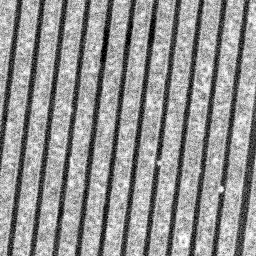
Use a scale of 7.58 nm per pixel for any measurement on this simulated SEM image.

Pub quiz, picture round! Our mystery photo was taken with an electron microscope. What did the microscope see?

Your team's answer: parallel lines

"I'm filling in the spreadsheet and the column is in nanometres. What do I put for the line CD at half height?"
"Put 112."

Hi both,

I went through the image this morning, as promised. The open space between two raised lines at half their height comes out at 59.2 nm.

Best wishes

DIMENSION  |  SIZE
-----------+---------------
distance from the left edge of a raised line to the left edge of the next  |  171 nm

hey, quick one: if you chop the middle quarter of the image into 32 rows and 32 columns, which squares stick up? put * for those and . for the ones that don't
***..****..***..****..****..***.
***..***...***..****..***...***.
***..***..****..****..***..****.
**...***..****..***...***..****.
**..****..****..***..****..****.
**..****..****..***..****..****.
**..****..***..****..****..***..
**..****..***..****..****..***..
**..****..***..****..****..***..
**..***..****..****..***...***..
**..***..****..****..***..****..
*...***..****..***...***..****..
*..****..****..***..****..****..
*..****..****..***..****..****..
*..****..***...***..****..***...
*..****..***..****..****..***..*
*..***...***..****..***...***..*
*..***..****..****..***..****..*
*..***..****..***...***..****..*
...***..****..***...***..****..*
..****..****..***..****..****..*
..****..****..***..****..****..*
..****..***..****..****..***..**
..****..***..****..****..***..**
..***...***..****..***...***..**
..***..****..***...***..****..**
..***..****..***...***..****..**
.****..****..***...***..****..**
.****..****..***..****..****..**
.****..***...***..****..***...**
.****..***..****..***...***..***
.****..***..****..***...***..***